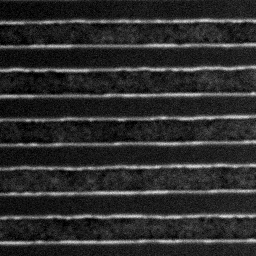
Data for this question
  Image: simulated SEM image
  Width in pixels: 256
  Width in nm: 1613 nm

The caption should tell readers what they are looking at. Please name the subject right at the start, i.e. lines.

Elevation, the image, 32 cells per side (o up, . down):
oooooooooooooooooooooooooooooooo
oooooooooooooooooooooooooooooooo
oooooooooooooooooooooooooooooooo
................................
................................
................................
oooooooooooooooooooooooooooooooo
oooooooooooooooooooooooooooooooo
ooooooooooooooooooooooooooooooo.
................................
................................
................................
oooooooooooooooooooooooooooooooo
oooooooooooooooooooooooooooooooo
oooooooooooooooooooooooooooooooo
................................
................................
................................
oooooooooooooooooooooooooooooooo
oooooooooooooooooooooooooooooooo
oooooooooooooooooooooooooooooooo
................................
................................
................................
oooooooooooooooooooooooooooooooo
oooooooooooooooooooooooooooooooo
oooooooooooooooooooooooooooooooo
................................
................................
................................
oooooooooooooooooooooooooooooooo
oooooooooooooooooooooooooooooooo